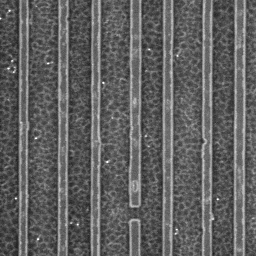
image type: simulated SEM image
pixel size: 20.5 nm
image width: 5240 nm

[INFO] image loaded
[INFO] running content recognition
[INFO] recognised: parallel lines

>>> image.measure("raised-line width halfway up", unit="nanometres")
161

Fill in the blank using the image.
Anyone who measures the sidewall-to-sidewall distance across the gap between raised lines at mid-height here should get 564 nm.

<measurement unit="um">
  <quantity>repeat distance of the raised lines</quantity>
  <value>0.737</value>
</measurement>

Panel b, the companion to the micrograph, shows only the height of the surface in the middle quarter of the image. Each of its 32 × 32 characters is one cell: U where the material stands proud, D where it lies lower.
UDDDDDDUUDDDDDDDDUUDDDDDDUUDDDDD
UDDDDDDUUDDDDDDDDUUDDDDDDUUDDDDD
UDDDDDDUUDDDDDDDDUUDDDDDDUUDDDDD
UDDDDDDUUDDDDDDDDUUDDDDDDUUDDDDD
UDDDDDDUUDDDDDDDDUUDDDDDDUUDDDDD
UDDDDDDUUDDDDDDDDUUDDDDDDUUDDDDD
UDDDDDDUUDDDDDDDDUUDDDDDDUUDDDDD
UDDDDDDUUDDDDDDDDUUDDDDDDUUDDDDD
UDDDDDDUUDDDDDDDDUUDDDDDDUUDDDDD
UDDDDDDUUDDDDDDDDUUDDDDDDUUDDDDD
UDDDDDDUUDDDDDDDDUUDDDDDDUUDDDDD
UDDDDDDUUDDDDDDDDUUDDDDDDUUDDDDD
UDDDDDDUUDDDDDDDDUUDDDDDDUUDDDDD
UDDDDDDUUDDDDDDDDUUDDDDDDUUDDDDD
UDDDDDDUUDDDDDDDDUUDDDDDDUUDDDDD
UDDDDDDUUDDDDDDDDUUDDDDDDUUDDDDD
UDDDDDDUUDDDDDDDDUUDDDDDDUUDDDDD
UDDDDDDUUDDDDDDDDUUDDDDDDUUDDDDD
UDDDDDDUUDDDDDDDDUUDDDDDDUUDDDDD
UDDDDDDUUDDDDDDDDUUDDDDDDUUDDDDD
UDDDDDDUUDDDDDDDDUUDDDDDDUUDDDDD
UDDDDDDUUDDDDDDDDUUDDDDDDUUDDDDD
UDDDDDDUUDDDDDDDDUUDDDDDDUUDDDDD
UDDDDDDUUDDDDDDDDUUDDDDDDUUDDDDD
UDDDDDDUUDDDDDDDDUUDDDDDDUUDDDDD
UDDDDDDUUDDDDDDDUUUDDDDDDUUDDDDD
UDDDDDDUUDDDDDDDUUUDDDDDDUUDDDDD
UDDDDDDUUDDDDDDDUUUDDDDDDUUDDDDD
UDDDDDDUUDDDDDDDUUUDDDDDDUUDDDDD
UDDDDDDUUDDDDDDDUUUDDDDDDUUDDDDD
UDDDDDDUUDDDDDDDUUUDDDDDDUUDDDDD
UDDDDDDUUDDDDDDDUUUDDDDDDUUDDDDD